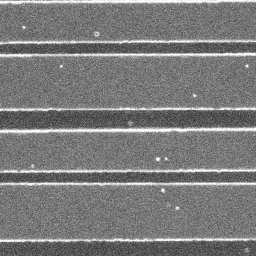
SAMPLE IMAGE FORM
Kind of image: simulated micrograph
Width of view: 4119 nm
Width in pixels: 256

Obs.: lines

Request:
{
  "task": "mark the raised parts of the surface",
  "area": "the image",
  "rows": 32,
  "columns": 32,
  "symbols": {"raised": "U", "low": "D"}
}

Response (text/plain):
UUUUUUUUUUUUUUUUUUUUUUUUUUUUUUUU
UUUUUUUUUUUUUUUUUUUUUUUUUUUUUUUU
UUUUUUUUUUUUUUUUUUUUUUUUUUUUUUUU
UUUUUUUUUUUUUUUUUUUUUUUUUUUUUUUU
UUUUUUUUUUUUUUUUUUUUUUUUUUUUUUUU
DDDDDDDDDDDDDDDDDDDDDDDDDDDDDDDD
DDDDDDDDDDDDDDDDDDDDDDDDDDDDDDDD
UUUUUUUUUUUUUUUUUUUUUUUUUUUUUUUU
UUUUUUUUUUUUUUUUUUUUUUUUUUUUUUUU
UUUUUUUUUUUUUUUUUUUUUUUUUUUUUUUU
UUUUUUUUUUUUUUUUUUUUUUUUUUUUUUUU
UUUUUUUUUUUUUUUUUUUUUUUUUUUUUUUU
UUUUUUUUUUUUUUUUUUUUUUUUUUUUUUUU
UUUUUUUUUUUUUUUUUUUUUUUUUUUUUUUU
DDDDDDDDDDDDDDDDDDDDDDDDDDDDDDDD
DDDDDDDDDDDDDDDDDDDDDDDDDDDDDDDD
UUUUUUUUUUUUUUUUUUUUUUUUUUUUUUUU
UUUUUUUUUUUUUUUUUUUUUUUUUUUUUUUU
UUUUUUUUUUUUUUUUUUUUUUUUUUUUUUUU
UUUUUUUUUUUUUUUUUUUUUUUUUUUUUUUU
UUUUUUUUUUUUUUUUUUUUUUUUUUUUUUUU
DDDDDDDDDDDDDDDDDDDDDDDDDDDDDDDD
DDDDDDDDDDDDDDDDDDDDDDDDDDDDDDDD
UUUUUUUUUUUUUUUUUUUUUUUUUUUUUUUU
UUUUUUUUUUUUUUUUUUUUUUUUUUUUUUUU
UUUUUUUUUUUUUUUUUUUUUUUUUUUUUUUU
UUUUUUUUUUUUUUUUUUUUUUUUUUUUUUUU
UUUUUUUUUUUUUUUUUUUUUUUUUUUUUUUU
UUUUUUUUUUUUUUUUUUUUUUUUUUUUUUUU
UUUUUUUUUUUUUUUUUUUUUUUUUUUUUUUU
DDDDDDDDDDDDDDDDDDDDDDDDDDDDDDDD
DDDDDDDDDDDDDDDDDDDDDDDDDDDDDDDD